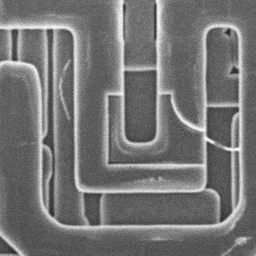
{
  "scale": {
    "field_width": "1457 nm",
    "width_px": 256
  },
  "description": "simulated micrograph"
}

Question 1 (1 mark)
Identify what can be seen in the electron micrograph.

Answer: wiring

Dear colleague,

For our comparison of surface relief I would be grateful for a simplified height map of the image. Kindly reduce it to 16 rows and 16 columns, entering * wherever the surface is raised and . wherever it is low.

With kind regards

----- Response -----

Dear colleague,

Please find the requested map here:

********..******
********..******
.....***..***..*
.....***..***..*
**...***..***..*
***..***..***..*
***..***..***..*
***..***..***..*
***..***..***..*
***..********..*
***..********..*
***..********..*
***............*
***...........**
****************
.***************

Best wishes